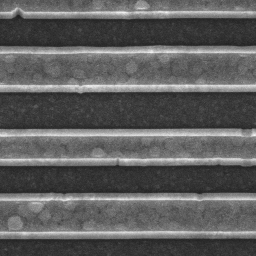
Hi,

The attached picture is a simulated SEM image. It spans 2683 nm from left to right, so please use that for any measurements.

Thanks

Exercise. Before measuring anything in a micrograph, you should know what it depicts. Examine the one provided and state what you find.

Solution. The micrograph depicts one or a few lines or trenches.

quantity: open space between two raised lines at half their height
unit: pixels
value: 34.3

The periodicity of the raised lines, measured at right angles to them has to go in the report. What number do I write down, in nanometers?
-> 768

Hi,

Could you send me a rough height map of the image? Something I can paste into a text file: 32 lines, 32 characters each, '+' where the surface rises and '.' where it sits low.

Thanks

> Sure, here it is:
++++++++++++++++++++++++++++++++
++++++++++++++++++++++++++++++++
................................
................................
................................
................................
++++++++++++++++++++++++++++++++
++++++++++++++++++++++++++++++++
++++++++++++++++++++++++++++++++
++++++++++++++++++++++++++++++++
++++++++++++++++++++++++++++++++
................................
................................
................................
................................
................................
................................
++++++++++++++++++++++++++++++++
++++++++++++++++++++++++++++++++
++++++++++++++++++++++++++++++++
................................
................................
................................
................................
......+.........................
++++++++++++++++++++++++++++++++
++++++++++++++++++++++++++++++++
++++++++++++++++++++++++++++++++
++++++++++++++++++++++++++++++++
................................
................................
................................